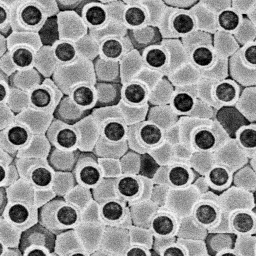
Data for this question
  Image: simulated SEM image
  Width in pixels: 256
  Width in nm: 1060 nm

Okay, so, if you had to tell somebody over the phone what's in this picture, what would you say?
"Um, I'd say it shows a regular array of holes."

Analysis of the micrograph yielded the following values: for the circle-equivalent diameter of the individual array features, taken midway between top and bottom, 84.9 nanometres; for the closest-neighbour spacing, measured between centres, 0.165 microns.